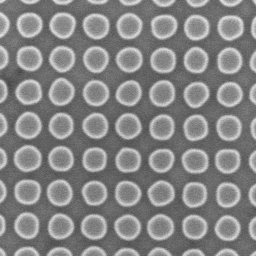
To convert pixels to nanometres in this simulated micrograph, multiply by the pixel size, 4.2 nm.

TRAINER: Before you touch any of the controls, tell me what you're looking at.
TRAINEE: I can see an array of small figures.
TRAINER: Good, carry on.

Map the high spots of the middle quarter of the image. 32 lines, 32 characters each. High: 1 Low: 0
11000111110000111110001111100011
10000011110000011100000111100001
00000000000000000000000000000000
00000000000000000000000000000000
10000011100000001100000011000000
11000111110000111110001111100001
11000111111001111110001111100011
11000111111001111110011111100011
11000111111001111110001111100011
10000011110000111100001111100001
00000000000000000000000000000001
00000000000000000000000000000000
00000001100000011000000000000000
11000011110000111100000111100001
11000111111001111110001111100011
11000111111001111110001111100011
11000111111001111110001111100011
11000011110000111110001111100011
00000000100000011000001111000001
00000000000000000000000000000000
00000000000000000000000000000000
10000011110000111100000111000000
11000111110000111110001111100011
11000111110001111110011111100011
11000111110001111110011111100011
11000111110001111110001111100011
10000011100000111100000111000001
00000000000000000000000000000000
00000000000000000000000000000000
00000001100000111000000110000000
10000111110001111100001111100011
11000111111001111110011111100011